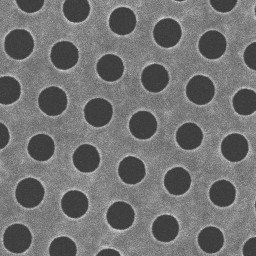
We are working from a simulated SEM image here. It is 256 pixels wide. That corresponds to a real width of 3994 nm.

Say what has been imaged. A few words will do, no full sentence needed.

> a regular array of holes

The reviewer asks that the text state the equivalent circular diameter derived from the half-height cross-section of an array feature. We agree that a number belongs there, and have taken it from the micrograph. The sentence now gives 0.447 µm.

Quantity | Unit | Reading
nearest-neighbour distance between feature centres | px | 46.6